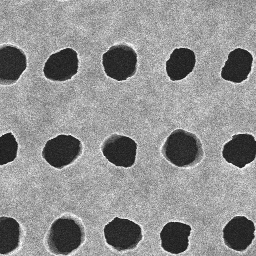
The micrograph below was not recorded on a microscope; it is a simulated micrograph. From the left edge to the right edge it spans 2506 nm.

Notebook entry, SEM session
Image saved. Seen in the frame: a regular array of holes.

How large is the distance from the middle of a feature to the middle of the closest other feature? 58 pixels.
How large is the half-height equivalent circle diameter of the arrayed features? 325 nm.